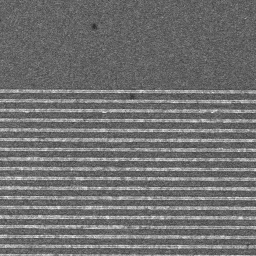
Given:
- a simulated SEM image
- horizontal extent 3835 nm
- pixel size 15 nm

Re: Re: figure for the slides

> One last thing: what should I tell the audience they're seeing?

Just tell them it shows parallel lines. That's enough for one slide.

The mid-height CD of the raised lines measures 0.0318 um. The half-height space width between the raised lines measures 0.118 microns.